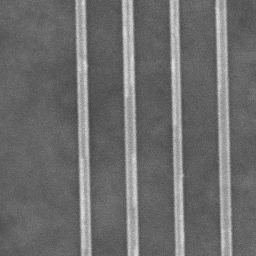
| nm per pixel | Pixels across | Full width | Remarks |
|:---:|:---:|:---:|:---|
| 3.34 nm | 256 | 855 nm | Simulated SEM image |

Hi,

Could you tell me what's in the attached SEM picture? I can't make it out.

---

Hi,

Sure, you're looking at parallel lines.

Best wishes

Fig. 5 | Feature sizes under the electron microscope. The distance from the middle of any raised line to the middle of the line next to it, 156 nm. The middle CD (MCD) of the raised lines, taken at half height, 29.2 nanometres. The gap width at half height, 129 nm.